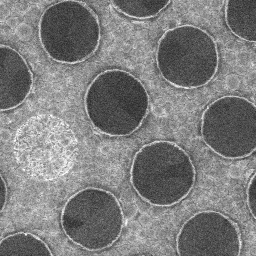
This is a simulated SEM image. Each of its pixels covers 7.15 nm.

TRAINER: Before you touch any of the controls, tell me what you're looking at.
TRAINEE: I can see raised bodies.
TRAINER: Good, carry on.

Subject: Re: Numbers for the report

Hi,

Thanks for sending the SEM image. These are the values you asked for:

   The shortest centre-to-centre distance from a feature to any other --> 83.6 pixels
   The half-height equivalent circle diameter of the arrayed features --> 457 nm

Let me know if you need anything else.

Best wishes